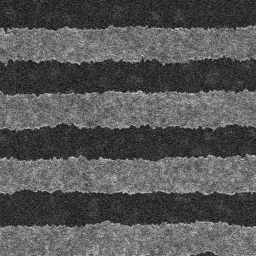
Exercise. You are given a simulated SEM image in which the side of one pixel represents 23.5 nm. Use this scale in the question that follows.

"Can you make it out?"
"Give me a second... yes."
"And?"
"one or a few lines or trenches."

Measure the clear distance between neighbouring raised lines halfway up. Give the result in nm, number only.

761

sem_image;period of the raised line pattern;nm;1540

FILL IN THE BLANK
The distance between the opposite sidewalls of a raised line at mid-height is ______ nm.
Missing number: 764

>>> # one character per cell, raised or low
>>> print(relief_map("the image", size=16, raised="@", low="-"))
----------------
----------------
@@@@@@@@@@@@@@@@
@@@@@@@@@@@@@@@@
----------------
----------------
@@@@@@@@@@@@@@@@
@@@@@@@@@@@@@@@@
----------------
----------------
@@@@@@@@@@@@@@@@
@@@@@@@@@@@@@@@@
----------------
----------------
@@@@@@@@@@@@@@@@
@@@@@@@@@@@@@@@@